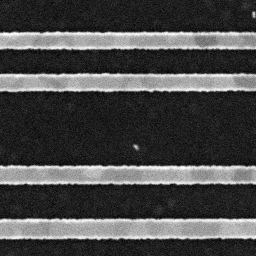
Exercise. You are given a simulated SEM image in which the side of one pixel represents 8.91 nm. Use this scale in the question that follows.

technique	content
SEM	lines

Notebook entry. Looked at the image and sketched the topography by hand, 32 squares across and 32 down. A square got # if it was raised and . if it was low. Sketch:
................................
................................
................................
................................
################################
################################
................................
................................
................................
################################
################################
................................
................................
................................
................................
................................
................................
................................
................................
................................
................................
################################
################################
................................
................................
................................
................................
##.#############################
################################
################################
................................
................................